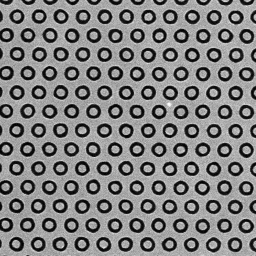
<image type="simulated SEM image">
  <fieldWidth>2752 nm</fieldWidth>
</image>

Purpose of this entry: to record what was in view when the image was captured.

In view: a regular array of ring-shaped grooves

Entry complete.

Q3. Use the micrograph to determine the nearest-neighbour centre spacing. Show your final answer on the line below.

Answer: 230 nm